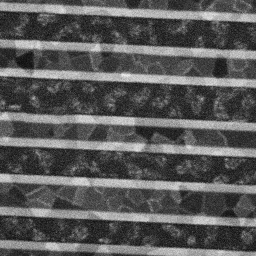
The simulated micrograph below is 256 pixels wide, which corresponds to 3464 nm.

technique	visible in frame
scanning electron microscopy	one or a few lines or trenches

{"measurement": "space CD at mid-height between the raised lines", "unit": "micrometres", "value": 0.485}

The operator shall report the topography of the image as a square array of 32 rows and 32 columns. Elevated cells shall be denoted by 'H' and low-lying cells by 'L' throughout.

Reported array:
HHHHHHHHHHHHHHHHHHHHHHHHHHHHHHHH
LLLLLLLLLLLLLLHHHHHHHHHHHHHHHHHH
LLLLLLLLLLLLLLLLLLLLLLLLLLLLLLLL
LLLLLLLLLLLLLLLLLLLLLLLLLLLLLLLL
LLLLLLLLLLLLLLLLLLLLLLLLLLLLLLLL
HHLLLLLLLLLLLLLLLLLLLLLLLLLLLLLL
HHHHHHHHHHHHHHHHHHHHHHHLLLLLLLLL
HHHHHHHHHHHHHHHHHHHHHHHHHHHHHHHH
HHHHHHHHHHHHHHHHHHHHHHHHHHHHHHHH
LLLLLLLLLLLHHHHHHHHHHHHHHHHHHHHH
LLLLLLLLLLLLLLLLLLLLLLLLLLLLLLLL
LLLLLLLLLLLLLLLLLLLLLLLLLLLLLLLL
LLLLLLLLLLLLLLLLLLLLLLLLLLLLLLLL
LLLLLLLLLLLLLLLLLLLLLLLLLLLLLLLL
LLLLLLLLLLLLLLLLLLLLLLLLLLLLLLLL
HHHHHHHHHHHHHHHHHHHHHHHHLLLLLLLL
HHHHHHHHHHHHHHHHHHHHHHHHHHHHHHHH
HHHHHHHHHHHHHHHHHHHHHHHHHHHHHHHH
LLLLLLLLLLLLLLLLLLLHHHHHHHHHHHHH
LLLLLLLLLLLLLLLLLLLLLLLLLLLLLLLL
LLLLLLLLLLLLLLLLLLLLLLLLLLLLLLLL
LLLLLLLLLLLLLLLLLLLLLLLLLLLLLLLL
HHHHHHLLLLLLLLLLLLLLLLLLLLLLLLLL
HHHHHHHHHHHHHHHHHHHHHHHHHHHHLLLL
HHHHHHHHHHHHHHHHHHHHHHHHHHHHHHHH
HHHHHHHHHHHHHHHHHHHHHHHHHHHHHHHH
LLLHHHHHHHHHHHHHHHHHHHHHHHHHHHHH
LLLLLLLLLLLLLLLLLLLLLLLLHHHHHHHH
LLLLLLLLLLLLLLLLLLLLLLLLLLLLLLLL
LLLLLLLLLLLLLLLLLLLLLLLLLLLLLLLL
LLLLLLLLLLLLLLLLLLLLLLLLLLLLLLLL
HHHHHHHHHHHHHHHHHHHHHHLLLLLLLLLL